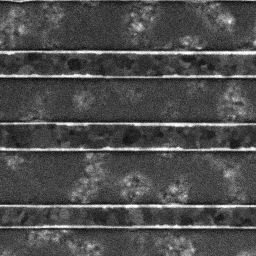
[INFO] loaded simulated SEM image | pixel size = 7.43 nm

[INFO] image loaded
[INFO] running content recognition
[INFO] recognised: one or a few lines or trenches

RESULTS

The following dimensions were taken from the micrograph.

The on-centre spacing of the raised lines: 0.567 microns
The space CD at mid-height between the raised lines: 372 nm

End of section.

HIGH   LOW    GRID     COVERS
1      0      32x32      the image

00000000000000000000000000000000
00000000000000000000000000000000
00000000000000000000000000001000
00000000000000000000000000000000
00000000000000000000000000000000
00000000000000000000000000000000
11111111111111111111111111100000
11111111111111111111111111111111
11111111111111111111111111111111
11111111111111111111111111111111
00000000000000000000000000000000
00000000000000000000000000000000
00000000000000000000000000000000
00000000000000000000000000000000
00000000000000000000000000000000
01111111111111111111111100000000
11111111111111111111111111111111
11111111111111111111111111111111
11111111111111111111111111111111
00000000000000000000000000000000
00000000000000000000000000000000
00000000000000000000000000000000
00000000000000000000000000000000
00000000000000000000000000000000
00000000000000000000000000000000
00000000000000000000000000000000
11111111111111111111111111111111
11111111111111111111111111111111
00000100000000000000000000000000
00000000000000000000000000000000
00000000000000000000000000000000
00000000000000000000000100000000